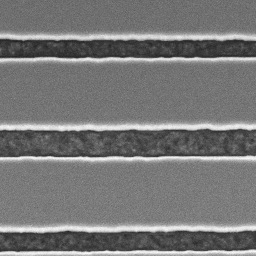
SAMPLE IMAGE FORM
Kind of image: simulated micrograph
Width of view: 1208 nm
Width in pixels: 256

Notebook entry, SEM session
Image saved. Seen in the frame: lines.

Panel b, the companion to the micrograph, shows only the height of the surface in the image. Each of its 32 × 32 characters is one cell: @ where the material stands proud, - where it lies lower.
@@@@@@@@@@@@@@@@@@@@@@@@@@@@@@@@
@@@@@@@@@@@@@@@@@@@@@@@@@@@@@@@@
@@@@@@@@@@@@@@@@@@@@@@@@@@@@@@@@
@@@@@@@@@@@@@@@@@@@@@@@@@@@@@@@@
@@@@@@@@@@@@@@@@@@@@@@@@@@@@@@@@
--------------------------------
--------------------------------
@@@@@@@@@@@@@@@@@@@@@@@@@@@@@@@@
@@@@@@@@@@@@@@@@@@@@@@@@@@@@@@@@
@@@@@@@@@@@@@@@@@@@@@@@@@@@@@@@@
@@@@@@@@@@@@@@@@@@@@@@@@@@@@@@@@
@@@@@@@@@@@@@@@@@@@@@@@@@@@@@@@@
@@@@@@@@@@@@@@@@@@@@@@@@@@@@@@@@
@@@@@@@@@@@@@@@@@@@@@@@@@@@@@@@@
@@@@@@@@@@@@@@@@@@@@@@@@@@@@@@@@
@@@@@@@@@@@@@@@@@@@@@@@@@@@@@@@@
--------------------------------
--------------------------------
--------------------------------
--------------------------------
@@@@@@@@@@@@@@@@@@@@@@@@@@@@@@@@
@@@@@@@@@@@@@@@@@@@@@@@@@@@@@@@@
@@@@@@@@@@@@@@@@@@@@@@@@@@@@@@@@
@@@@@@@@@@@@@@@@@@@@@@@@@@@@@@@@
@@@@@@@@@@@@@@@@@@@@@@@@@@@@@@@@
@@@@@@@@@@@@@@@@@@@@@@@@@@@@@@@@
@@@@@@@@@@@@@@@@@@@@@@@@@@@@@@@@
@@@@@@@@@@@@@@@@@@@@@@@@@@@@@@@@
@@@@@@@@@@@@@@@@@@@@@@@@@@@@@@@@
--------------------------------
--------------------------------
@@-@@@@@@@@@@@@@@@@@@@@@@@@@@@@@